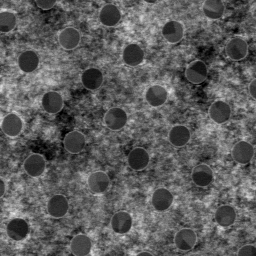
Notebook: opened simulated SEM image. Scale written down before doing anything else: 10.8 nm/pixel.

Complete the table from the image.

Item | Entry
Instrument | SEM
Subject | a regular array of raised bodies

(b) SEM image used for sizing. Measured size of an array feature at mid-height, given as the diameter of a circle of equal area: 244 nanometres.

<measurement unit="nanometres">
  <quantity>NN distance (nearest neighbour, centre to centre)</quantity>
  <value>496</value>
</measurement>